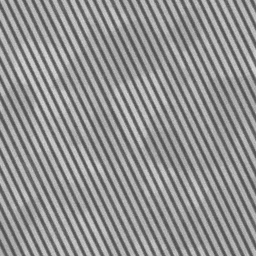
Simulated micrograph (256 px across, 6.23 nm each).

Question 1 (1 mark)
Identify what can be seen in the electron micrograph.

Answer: parallel lines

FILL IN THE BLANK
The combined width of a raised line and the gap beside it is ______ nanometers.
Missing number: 49.2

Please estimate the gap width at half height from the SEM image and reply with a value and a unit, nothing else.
26.6 nm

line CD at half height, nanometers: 21.1